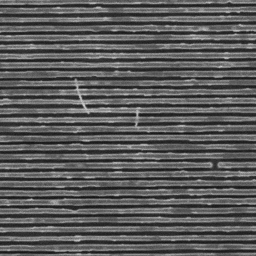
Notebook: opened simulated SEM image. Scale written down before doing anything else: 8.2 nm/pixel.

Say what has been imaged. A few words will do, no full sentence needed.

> parallel lines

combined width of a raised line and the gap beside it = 74.8 nm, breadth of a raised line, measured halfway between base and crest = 42 nanometers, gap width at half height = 0.0287 micrometres